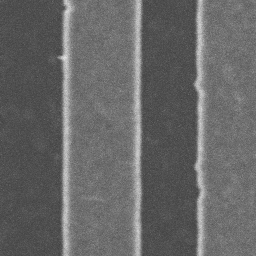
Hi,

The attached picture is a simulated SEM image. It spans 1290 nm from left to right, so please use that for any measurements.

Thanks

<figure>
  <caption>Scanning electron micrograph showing one or a few lines or trenches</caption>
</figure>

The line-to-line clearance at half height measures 0.307 microns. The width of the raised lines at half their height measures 370 nm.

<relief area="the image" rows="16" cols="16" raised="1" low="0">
0000111110001111
0000111110001111
0000111110001111
0000111110001111
0000111110001111
0000111110001111
0000111110000111
0000111110000111
0000111110000111
0000111110001111
0000111110001111
0000111110001111
0000111110000111
0000111110000111
0000111110000111
0000111110001111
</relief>